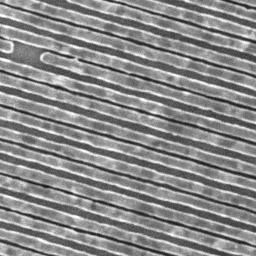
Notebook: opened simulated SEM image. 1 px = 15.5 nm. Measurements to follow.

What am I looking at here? parallel lines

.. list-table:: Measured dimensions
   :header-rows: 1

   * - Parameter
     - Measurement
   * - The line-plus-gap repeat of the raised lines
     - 16.3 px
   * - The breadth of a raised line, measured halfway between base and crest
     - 0.158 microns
